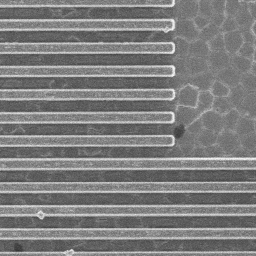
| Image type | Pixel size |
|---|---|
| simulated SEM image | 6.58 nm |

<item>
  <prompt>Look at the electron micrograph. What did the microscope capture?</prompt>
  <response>parallel lines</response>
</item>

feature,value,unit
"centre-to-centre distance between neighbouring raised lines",153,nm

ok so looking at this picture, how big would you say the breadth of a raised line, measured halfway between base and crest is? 65 nm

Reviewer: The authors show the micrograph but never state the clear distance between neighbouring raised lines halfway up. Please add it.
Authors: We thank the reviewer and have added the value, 12.9 pixels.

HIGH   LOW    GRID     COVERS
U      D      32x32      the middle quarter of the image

DDDDDDDDDDDDDDDDDDDDDDDDDDDDDDDD
UUUUUUUUUUUUUUUUUUUUUUUUUUUDDDDD
UUUUUUUUUUUUUUUUUUUUUUUUUUUDDDDD
DDDDDDDDDDDDDDDDDDDDDDDDDDDDDDDD
DDDDDDDDDDDDDDDDDDDDDDDDDDDDDDDD
DDDDDDDDDDDDDDDDDDDDDDDDDDDDDDDD
UUUUUUUUUUUUUUUUUUUUUUUUUUUDDDDD
UUUUUUUUUUUUUUUUUUUUUUUUUUUUDDDD
UUUUUUUUUUUUUUUUUUUUUUUUUUUDDDDD
DDDDDDDDDDDDDDDDDDDDDDDDDDDDDDDD
DDDDDDDDDDDDDDDDDDDDDDDDDDDDDDDD
DDDDDDDDDDDDDDDDDDDDDDDDDDDDDDDD
UUUUUUUUUUUUUUUUUUUUUUUUUUUDDDDD
UUUUUUUUUUUUUUUUUUUUUUUUUUUDDDDD
UUUUUUUUUUUUUUUUUUUUUUUUUUUDDDDD
DDDDDDDDDDDDDDDDDDDDDDDDDDDDDDDD
DDDDDDDDDDDDDDDDDDDDDDDDDDDDDDDD
DDDDDDDDDDDDDDDDDDDDDDDDDDDDDDDD
UUUUUUUUUUUUUUUUUUUUUUUUUUUDDDDD
UUUUUUUUUUUUUUUUUUUUUUUUUUUDDDDD
DDDDDDDDDDDDDDDDDDDDDDDDDDDDDDDD
DDDDDDDDDDDDDDDDDDDDDDDDDDDDDDDD
DDDDDDDDDDDDDDDDDDDDDDDDDDDDDDDD
DDDDDDDDDDDDDDDDDDDDDDDDDDDDDDDD
UUUUUUUUUUUUUUUUUUUUUUUUUUUUUUUU
UUUUUUUUUUUUUUUUUUUUUUUUUUUUUUUU
DDDDDDDDDDDDDDDDDDDDDDDDDDDDDDDD
DDDDDDDDDDDDDDDDDDDDDDDDDDDDDDDD
DDDDDDDDDDDDDDDDDDDDDDDDDDDDDDDD
DDDDDDDDDDDDDDDDDDDDDDDDDDDDDDDD
UUUUUUUUUUUUUUUUUUUUUUUUUUUUUUUU
UUUUUUUUUUUUUUUUUUUUUUUUUUUUUUUU